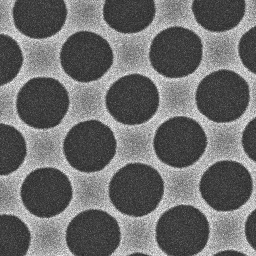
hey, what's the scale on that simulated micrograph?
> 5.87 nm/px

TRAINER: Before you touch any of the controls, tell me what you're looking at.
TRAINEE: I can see a regular array of holes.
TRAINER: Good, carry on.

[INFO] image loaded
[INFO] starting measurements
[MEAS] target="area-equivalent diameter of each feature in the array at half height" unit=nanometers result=313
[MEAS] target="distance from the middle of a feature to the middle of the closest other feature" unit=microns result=0.372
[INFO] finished